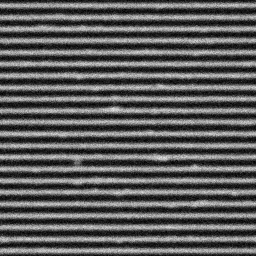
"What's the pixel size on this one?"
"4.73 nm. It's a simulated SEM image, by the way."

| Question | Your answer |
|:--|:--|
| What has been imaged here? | parallel lines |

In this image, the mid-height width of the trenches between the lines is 34.3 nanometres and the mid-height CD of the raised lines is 20.1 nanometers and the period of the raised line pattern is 55.2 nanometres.